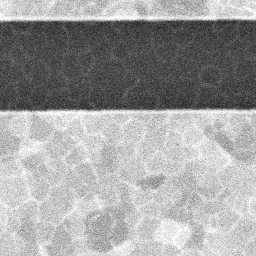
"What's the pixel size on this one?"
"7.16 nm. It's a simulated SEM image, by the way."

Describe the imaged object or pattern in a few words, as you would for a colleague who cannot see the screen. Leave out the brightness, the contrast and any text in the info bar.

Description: one or a few lines or trenches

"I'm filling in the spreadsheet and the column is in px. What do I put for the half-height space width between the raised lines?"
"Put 94.4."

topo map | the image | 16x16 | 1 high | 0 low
1111111111111111
0000000000000000
0000000000000000
0000000000000000
0000000000000000
0000000000000000
0000000000000000
1111111111111111
1111111111111111
1111111111111111
1111111111111111
1111111111111111
1111111111111111
1111111111111111
1111111111111111
1111111111111111